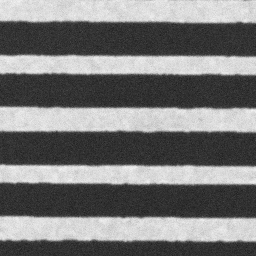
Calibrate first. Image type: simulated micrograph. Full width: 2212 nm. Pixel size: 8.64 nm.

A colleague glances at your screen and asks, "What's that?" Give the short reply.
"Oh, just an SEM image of lines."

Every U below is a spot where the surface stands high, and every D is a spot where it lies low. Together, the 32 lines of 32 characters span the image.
UUUUUUUUUUUUUUUUUUUUUUUUUUUUUUUU
UUUUUUUUUUUUUUUUUUUUUUUUUUUUUUUU
UUUUUUUUUUUUUUUUUUUUUUUUUUUUUUUU
DDDDDDDDDDDDDDDDDDDDDDDDDDDDDDDD
DDDDDDDDDDDDDDDDDDDDDDDDDDDDDDDD
DDDDDDDDDDDDDDDDDDDDDDDDDDDDDDDD
DDDDDDDDDDDDDDDDDDDDDDDDDDDDDDDD
UUUUUUUUUUUUUUUUUUUUUUUUUUUUUUUU
UUUUUUUUUUUUUUUUUUUUUUUUUUUUUUUU
DDDDDDDDDDDDDDDDDDDDDDDDDDDDDDDD
DDDDDDDDDDDDDDDDDDDDDDDDDDDDDDDD
DDDDDDDDDDDDDDDDDDDDDDDDDDDDDDDD
DDDDDDDDDDDDDDDDDDDDDDDDDDDDDDDD
UUUUDDDDDDDDDDDDDDDDDDDDDDDDDDDD
UUUUUUUUUUUUUUUUUUUUUUUUUUUUUUUU
UUUUUUUUUUUUUUUUUUUUUUUUUUUUUUUU
DDDDDDDDDDDDDDDDDDDDDDDDDDDDDDDD
DDDDDDDDDDDDDDDDDDDDDDDDDDDDDDDD
DDDDDDDDDDDDDDDDDDDDDDDDDDDDDDDD
DDDDDDDDDDDDDDDDDDDDDDDDDDDDDDDD
DDDDDDDDDDDDDDDDDDDDDDDDDDDDDDDD
UUUUUUUUUUUUUUUUUUUUUUUUUUUUUUUU
UUUUUUUUUUUUUUUUUUUUUUUUUUUUUUUU
DDDDDDDDDDDDDDDDDDDDDDDDDDDDDDDD
DDDDDDDDDDDDDDDDDDDDDDDDDDDDDDDD
DDDDDDDDDDDDDDDDDDDDDDDDDDDDDDDD
DDDDDDDDDDDDDDDDDDDDDDDDDDDDDDDD
UUUUUUUUUUUUUUUUUUUUUUUUUUUUUUUU
UUUUUUUUUUUUUUUUUUUUUUUUUUUUUUUU
UUUUUUUUUUUUUUUUUUUUUUUUUUUUUUUU
DDDDDDDDDDDDDDDDDDDDDDDDDDDDDDDD
DDDDDDDDDDDDDDDDDDDDDDDDDDDDDDDD